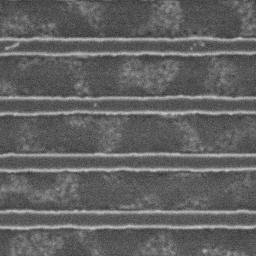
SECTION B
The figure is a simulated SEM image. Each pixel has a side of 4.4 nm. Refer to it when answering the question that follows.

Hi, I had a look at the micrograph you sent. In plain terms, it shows lines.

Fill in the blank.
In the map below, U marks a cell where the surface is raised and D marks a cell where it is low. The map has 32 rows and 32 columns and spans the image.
DDDDDDDDDDDDDDDDDDDDDDDDDDDDDDDD
DDDDDDDDDDDDDDDDDDDDDDDDDDDDDDDD
DDDDDDDDDDDDDDDDDDDDDDDDDDDDDDDD
DDDDDDDDDDDDDDDDDDDDDDDDDDDDDDDD
DDDDDDDDDDDDDDDDDDDDDDDDDDDDDDDD
UUUUUUUUUUUUUUUUUUUUUUUUUUUUUUUU
UUUUUUUUUUUUUUUUUUUUUUUUUUUUUUUU
DDDDDDDDDDDDDDDDDDDDDDDDDDDDDDDD
DDDDDDDDDDDDDDDDDDDDDDDDDDDDDDDD
DDDDDDDDDDDDDDDDDDDDDDDDDDDDDDDD
DDDDDDDDDDDDDDDDDDDDDDDDDDDDDDDD
DDDDDDDDDDDDDDDDDDDDDDDDDDDDDDDD
UUUUUUUUUUUUUUUUUUUUUUUUUUUUUUUU
UUUUUUUUUUUUUUUUUUUUUUUUUUUUUUUU
DDDDDDDDDDDDDDDDDDDDDDDDDDDDDDDD
DDDDDDDDDDDDDDDDDDDDDDDDDDDDDDDD
DDDDDDDDDDDDDDDDDDDDDDDDDDDDDDDD
DDDDDDDDDDDDDDDDDDDDDDDDDDDDDDDD
DDDDDDDDDDDDDDDDDDDDDDDDDDDDDDDD
UUUUUUUUUUUUUUUUUUUUUUUUUUUUUUUU
UUUUUUUUUUUUUUUUUUUUUUUUUUUUUUUU
DDDDDDDDDDDDDDDDDDDDDDDDDDDDDDDD
DDDDDDDDDDDDDDDDDDDDDDDDDDDDDDDD
DDDDDDDDDDDDDDDDDDDDDDDDDDDDDDDD
DDDDDDDDDDDDDDDDDDDDDDDDDDDDDDDD
DDDDDDDDDDDDDDDDDDDDDDDDDDDDDDDD
UUUUUUUUUUUUUUUUUUUUUUUUUUUUUUUU
UUUUUUUUUUUUUUUUUUUUUUUUUUUUUUUU
DUUUDDDDDDDUDDDDDDDDDDDDDDDDDDDD
DDDDDDDDDDDDDDDDDDDDDDDDDDDDDDDD
DDDDDDDDDDDDDDDDDDDDDDDDDDDDDDDD
DDDDDDDDDDDDDDDDDDDDDDDDDDDDDDDD